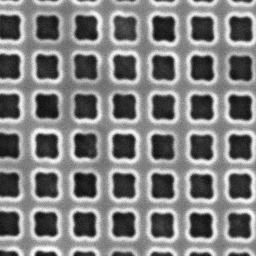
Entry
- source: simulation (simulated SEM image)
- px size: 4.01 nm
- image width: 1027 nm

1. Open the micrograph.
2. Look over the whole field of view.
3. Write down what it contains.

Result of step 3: a regular array of holes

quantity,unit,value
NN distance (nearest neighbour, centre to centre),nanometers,155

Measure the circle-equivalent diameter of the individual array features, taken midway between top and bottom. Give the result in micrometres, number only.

0.11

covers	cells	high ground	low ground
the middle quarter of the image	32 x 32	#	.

##......####......####......####
##......####......####......###.
##.......###......####......###.
###......####.....####......####
################################
################################
################################
###.....#####.##.######.##.#####
##......####......####......###.
##......####......####......###.
##......####......####......####
##......####......####......####
##.......###......####......###.
###.....#####.....####......####
################################
################################
################################
###.....####.....#####..##.#####
##......####......####......###.
##......####......####......###.
##......####......####......####
##......####......####......###.
###......###......####......###.
###.....####......####......####
################################
################################
################################
###.....####......####.....#####
##......####......####......###.
##......####......####......###.
##......####......####......###.
##......####......####......###.